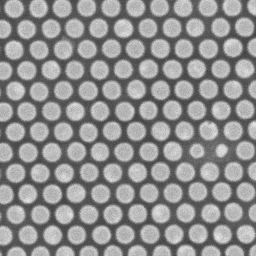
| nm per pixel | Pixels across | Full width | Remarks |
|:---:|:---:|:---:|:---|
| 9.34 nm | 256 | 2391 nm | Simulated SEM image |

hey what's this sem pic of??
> a regular array of raised bodies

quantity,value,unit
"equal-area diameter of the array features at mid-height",166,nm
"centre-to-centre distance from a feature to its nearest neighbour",219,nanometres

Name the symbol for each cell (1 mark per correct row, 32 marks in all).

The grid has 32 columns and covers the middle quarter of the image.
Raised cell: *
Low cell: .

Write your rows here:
.****..****..****..****..****..*
.****..****..****..****..****..*
.****..****..****..****..****..*
..**....**.................*....
*..........**....**....**....**.
**..****..****..****..****..****
**..****..****..****..****..****
**..****..****..****..****..****
*....**....**.....*....**....**.
..........................**....
.***...****..****..****..****..*
.****..****..****..****..****..*
.****..****..****..****..****..*
.***....**....***...**....**....
................................
*....**...****..****..****..****
**..****..****..****..****..****
**..****..****..****..****..****
*...****...**....***...***...**.
................................
..***..***...****...***..****...
.****..****..****..****..****...
.****..****..****..****..****...
..***..****...***...***...***...
................................
*....**....***...***..****...***
**..****..****..****..****..****
**..****..****..*****.****..****
**...***..****...***...***...***
................................
..**....**....**....**....**....
.****..****..****..****..****..*